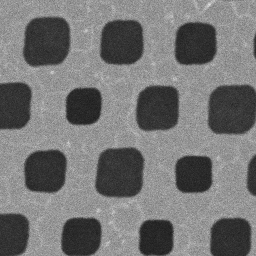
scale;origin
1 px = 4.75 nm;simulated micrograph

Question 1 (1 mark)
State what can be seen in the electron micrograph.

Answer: a regular array of holes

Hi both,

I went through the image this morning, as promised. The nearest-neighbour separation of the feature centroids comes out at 352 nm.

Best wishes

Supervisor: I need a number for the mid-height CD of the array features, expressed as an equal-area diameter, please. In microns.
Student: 0.214